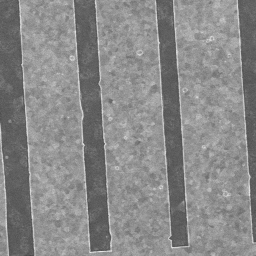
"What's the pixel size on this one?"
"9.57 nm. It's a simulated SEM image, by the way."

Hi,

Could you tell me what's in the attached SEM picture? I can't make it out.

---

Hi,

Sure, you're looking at one or a few lines or trenches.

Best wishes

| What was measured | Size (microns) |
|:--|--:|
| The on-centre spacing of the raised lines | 0.76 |